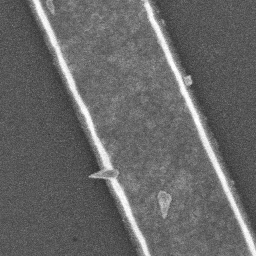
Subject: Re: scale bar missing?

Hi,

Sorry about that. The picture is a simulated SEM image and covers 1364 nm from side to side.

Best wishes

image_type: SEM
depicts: one or a few lines or trenches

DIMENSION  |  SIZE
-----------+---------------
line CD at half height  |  535 nanometres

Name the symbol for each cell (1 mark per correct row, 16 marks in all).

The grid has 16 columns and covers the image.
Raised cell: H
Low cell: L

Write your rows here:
LLHHHHHHHLLLLLLL
LLLHHHHHHHLLLLLL
LLLHHHHHHHLLLLLL
LLLLHHHHHHHLLLLL
LLLLHHHHHHHLLLLL
LLLLLHHHHHHLLLLL
LLLLLHHHHHHHLLLL
LLLLLLHHHHHHLLLL
LLLLLLHHHHHHHLLL
LLLLLLHHHHHHHLLL
LLLLLLHHHHHHHHLL
LLLLLLLHHHHHHHLL
LLLLLLLLHHHHHHLL
LLLLLLLLHHHHHHHL
LLLLLLLLLHHHHHHL
LLLLLLLLLHHHHHHH